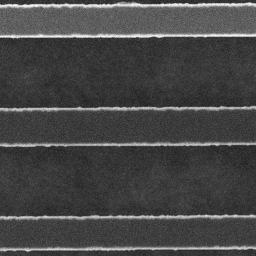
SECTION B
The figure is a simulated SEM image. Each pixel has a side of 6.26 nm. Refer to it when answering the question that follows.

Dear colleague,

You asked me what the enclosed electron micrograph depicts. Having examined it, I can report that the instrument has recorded lines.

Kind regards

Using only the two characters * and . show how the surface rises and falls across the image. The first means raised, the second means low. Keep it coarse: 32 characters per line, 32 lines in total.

................**..****.*******
********************************
********************************
********************************
********************************
................................
................................
................................
................................
................................
................................
................................
................................
............********************
********************************
********************************
********************************
********************************
................................
................................
................................
................................
................................
................................
................................
................................
................................
********************************
********************************
********************************
********************************
................................